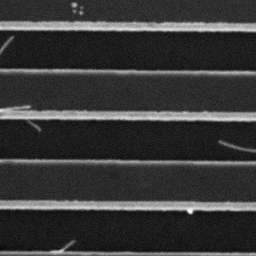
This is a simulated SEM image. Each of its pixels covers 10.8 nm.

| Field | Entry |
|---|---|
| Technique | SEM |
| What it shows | lines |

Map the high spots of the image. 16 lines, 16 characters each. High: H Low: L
HHHHHHHHHHHHHHHH
HHHHHHHHHHHHHHHH
LLLLLLLLLLLLLLLL
LLLLLLLLLLLLLLLL
HHHHHHHHHHLLLLLL
HHHHHHHHHHHHHHHH
HHHHHHHHHHHHHHHH
LLLLLLLLLLLLLLLL
LLLLLLLLLLLLLLLL
LLLLLLLLLLLLLLLL
HHHHHHHHHHHHHHHH
HHHHHHHHHHHHHHHH
HHHHHHHHHHHHHHHH
LLLLLLLLLLLLLLLL
LLLLLLLLLLLLLLLL
LLLLLLLLLLLLLLLL